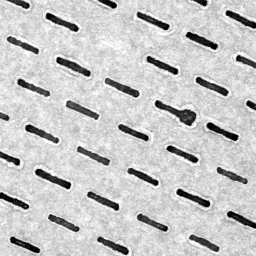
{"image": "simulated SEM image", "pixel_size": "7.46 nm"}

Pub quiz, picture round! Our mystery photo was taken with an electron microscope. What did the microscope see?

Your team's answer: a regular array of holes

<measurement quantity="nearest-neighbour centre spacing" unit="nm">332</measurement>